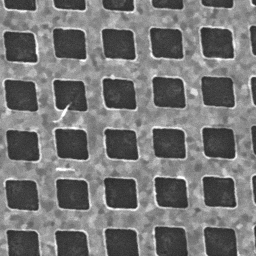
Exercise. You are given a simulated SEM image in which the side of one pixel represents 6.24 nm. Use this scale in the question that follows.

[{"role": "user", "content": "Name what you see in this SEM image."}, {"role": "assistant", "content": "a regular array of holes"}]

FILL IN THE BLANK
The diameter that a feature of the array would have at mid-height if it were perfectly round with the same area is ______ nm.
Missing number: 217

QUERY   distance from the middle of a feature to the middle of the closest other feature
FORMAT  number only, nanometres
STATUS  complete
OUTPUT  302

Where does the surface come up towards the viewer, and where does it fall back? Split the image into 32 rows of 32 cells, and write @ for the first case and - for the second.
@----@@----@@----@@----@@----@@@
@@@@@@@@@@@@@@@@@@@@@@@@@@@@@@@@
@@@@@@@@@@@@@@@@@@@@@@@@@@@@@@@@
@@@@@@@@@@@@@@@@@@@-@@@@@--@@@@-
----@@@----@@----@@----@@----@@-
@----@@----@@----@@----@@----@@-
@----@@----@@----@@----@@----@@@
@----@@@@@@@@@@--@@@@@@@@@@@@@@@
@@@@@@@@@@@@@@@@@@@@@@@@@@@@@@@@
@@@@@@@@@@@@@@@@@@@@@@@@@@@@@@@@
----@@@---@@@----@@----@@----@@-
@----@@----@@----@@----@@----@@-
@----@@----@@----@@----@@----@@@
@----@@----@@@---@@@@--@@@@@@@@@
@@@@@@@@@@@@@@@@@@@@@@@@@@@@@@@@
@@@@@@@@@@@@@@@@@@@@@@@@@@@@@@@@
@---@@@----@@----@@----@@----@@-
@----@@----@@----@@----@@----@@-
@----@@----@@----@@----@@----@@@
@----@@----@@@---@@@---@@@---@@@
@@@@@@@@@@@@@@@@@@@@@@@@@@@@@@@@
@@@@@@@@@@@@@@@@@@@@@@@@@@@@@@@@
@-@-@@@---@@@----@@----@@----@@-
@----@@----@@----@@----@@----@@@
@----@@----@@----@@----@@----@@@
@----@@----@@----@@@----@@----@@
@@@@@@@@@@@@@@@@@@@@@@@@@@@@@@@@
@@@@@@@@@@@@@@@@@@@@@@@@@@@@@@@@
@@@@@@@@@@@@@@@@@@@----@@@---@@@
@----@@----@@----@@----@@----@@@
@----@@----@@----@@----@@@----@@
@----@@----@@----@@@----@@----@@